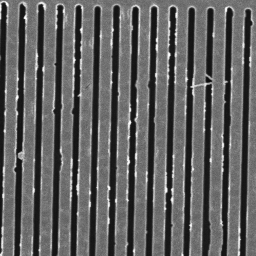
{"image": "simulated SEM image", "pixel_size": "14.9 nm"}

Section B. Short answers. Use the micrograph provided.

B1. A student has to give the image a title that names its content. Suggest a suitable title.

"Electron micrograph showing parallel lines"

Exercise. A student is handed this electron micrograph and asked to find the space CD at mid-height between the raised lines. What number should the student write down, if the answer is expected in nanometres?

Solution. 89.4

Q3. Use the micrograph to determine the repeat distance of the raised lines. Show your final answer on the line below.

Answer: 280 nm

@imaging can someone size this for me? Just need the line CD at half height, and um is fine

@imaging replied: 0.194